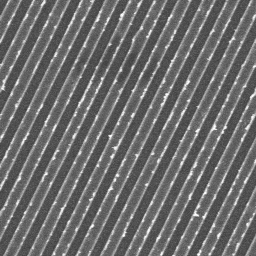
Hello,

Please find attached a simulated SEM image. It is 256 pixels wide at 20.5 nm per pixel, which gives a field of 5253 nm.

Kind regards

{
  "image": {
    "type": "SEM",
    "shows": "parallel lines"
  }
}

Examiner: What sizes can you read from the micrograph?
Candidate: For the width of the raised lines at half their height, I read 242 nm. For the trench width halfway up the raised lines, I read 209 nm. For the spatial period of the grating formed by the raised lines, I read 446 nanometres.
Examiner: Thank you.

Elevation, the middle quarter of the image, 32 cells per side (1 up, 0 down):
00111000111000111000111100111100
00111000111000111000111000111000
01110001110000110001111000111000
01110001110001110001110001110001
11100011100001110011110001110001
11100011100011100011100011100011
11000111100011100111100011100011
11000111000111000111000111000111
10001110000111001111000111000111
10001110001110001110001110001110
00011100001110001110001110001110
00011100011100011100011100011100
00111000111100011100011100011100
00111000111000111000111000111000
01110000111000111000111000111000
01110001110001110001110001110001
11100001110001110001110001110001
11100011100011100011100011100011
11000011100111100011100011100011
11000111000111000111000111000111
11000111000111000111000111000111
10001110001110001110001110001110
10001110001110001110001110001110
00011100011100011100011100011100
00011100011100011100011100011100
00111000111000111000111000111000
00111000111000111000111000111000
01110001110001110001110001110001
01110001110001110001110001110001
11100011100011100011100011100011
11100011100011100011100011100011
11000111000111000111000111000111